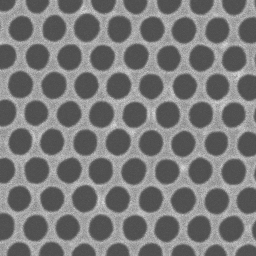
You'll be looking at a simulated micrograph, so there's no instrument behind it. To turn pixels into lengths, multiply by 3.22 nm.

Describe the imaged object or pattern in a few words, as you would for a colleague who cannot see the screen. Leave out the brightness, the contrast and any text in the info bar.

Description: a regular array of holes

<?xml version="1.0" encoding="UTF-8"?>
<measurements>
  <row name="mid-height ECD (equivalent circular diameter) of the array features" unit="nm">80.7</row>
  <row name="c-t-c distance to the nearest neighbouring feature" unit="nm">104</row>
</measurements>